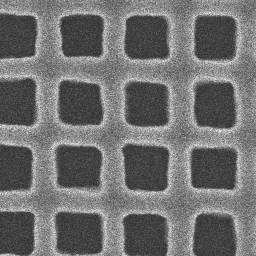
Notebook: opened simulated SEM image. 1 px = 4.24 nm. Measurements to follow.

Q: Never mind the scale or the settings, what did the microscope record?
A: a regular array of holes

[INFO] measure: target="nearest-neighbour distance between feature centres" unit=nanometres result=268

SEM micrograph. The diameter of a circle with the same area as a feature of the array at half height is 203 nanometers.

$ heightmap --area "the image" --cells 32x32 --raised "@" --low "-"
@@@@@@@@@@@@@@@@@@@@@@@@@@@@@@@@
@@@@@@@@@@@@@@@@@@@@@@@@@@@@@@@@
----@@@@-----@@@-----@@@-----@@@
-----@@@-----@@@-----@@@------@@
-----@@@-----@@@-----@@@------@@
----@@@@-----@@@-----@@@-----@@@
----@@@@-----@@@-----@@@-----@@@
@@@@@@@@@@@@@@@@@@@@@@@@@----@@@
@@@@@@@@@@@@@@@@@@@@@@@@@@@@@@@@
@@@@@@@@@@@@@@@@@@@@@@@@@@@@@@@@
-----@@@----@@@@----@@@@@----@@@
-----@@------@@@-----@@@-----@@@
-----@@------@@@-----@@@-----@@@
-----@@------@@@-----@@@-----@@@
-----@@------@@@-----@@@------@@
----@@@@----@@@@-----@@@@----@@@
@@@@@@@@@@@@@@@@@@@@@@@@@@@@@@@@
@@@@@@@@@@@@@@@@@@@@@@@@@@@@@@@@
---@@@@-----@@@------@@@@----@@@
----@@@------@@------@@@------@@
----@@@------@@------@@@------@@
----@@@------@@@-----@@@------@@
----@@@-----@@@@-----@@@-----@@@
----@@@@@---@@@@-----@@@@----@@@
@@@@@@@@@@@@@@@@@@@@@@@@@@@@@@@@
@@@@@@@@@@@@@@@@@@@@@@@@@@@@@@@@
----@@@@-@@@@@@@@@@@@@@@@@@@@@@@
----@@@------@@------@@@@----@@@
----@@@------@@------@@@-----@@@
----@@@------@@------@@@------@@
----@@@------@@------@@@------@@
----@@@-----@@@@-----@@@------@@